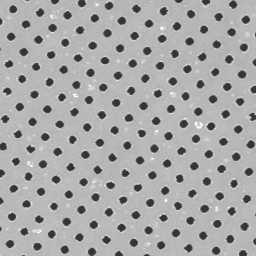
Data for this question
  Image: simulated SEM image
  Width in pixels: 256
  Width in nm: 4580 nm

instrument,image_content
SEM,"a regular array of holes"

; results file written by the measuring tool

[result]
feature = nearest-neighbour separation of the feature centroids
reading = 339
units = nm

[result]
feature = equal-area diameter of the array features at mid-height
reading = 7.82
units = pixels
